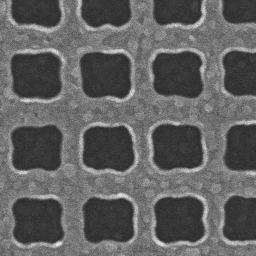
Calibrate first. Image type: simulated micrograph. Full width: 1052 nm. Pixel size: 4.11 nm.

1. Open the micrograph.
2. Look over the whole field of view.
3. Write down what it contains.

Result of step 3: a regular array of holes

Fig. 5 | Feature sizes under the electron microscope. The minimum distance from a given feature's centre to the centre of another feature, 289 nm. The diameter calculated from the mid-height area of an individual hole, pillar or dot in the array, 51.5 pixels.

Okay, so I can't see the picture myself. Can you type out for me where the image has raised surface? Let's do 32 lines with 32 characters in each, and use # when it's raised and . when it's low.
#......###......###......###....
#.......##......###......###....
##......##......###......###....
################################
################################
################################
#######################.#####..#
#......###......###......###....
#.......##......###......###....
#......###......###......###....
##......##......###......###....
##.....###......####.....####...
################################
################################
################################
################################
##......###.....###......###....
#.......##.......##......###....
##......##.......##......###....
##......##.......##......###....
##......###......##......###....
################################
################################
################################
################################
##......###.....###......###....
##......##.......##......###....
##......##.......##......###....
##......##.......##......###....
##......###......##......###....
###.############################
################################